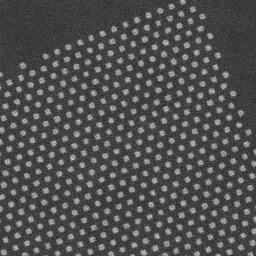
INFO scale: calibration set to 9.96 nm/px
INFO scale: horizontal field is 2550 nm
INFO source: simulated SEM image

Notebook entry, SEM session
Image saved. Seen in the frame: a regular array of raised bodies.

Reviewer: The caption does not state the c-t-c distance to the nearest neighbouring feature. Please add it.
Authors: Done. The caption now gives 118 nm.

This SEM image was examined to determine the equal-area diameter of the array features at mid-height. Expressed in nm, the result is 53.9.